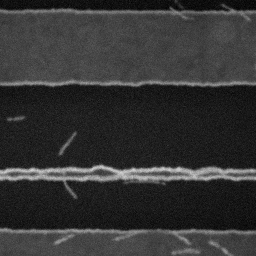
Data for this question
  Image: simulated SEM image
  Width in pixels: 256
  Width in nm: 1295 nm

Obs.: lines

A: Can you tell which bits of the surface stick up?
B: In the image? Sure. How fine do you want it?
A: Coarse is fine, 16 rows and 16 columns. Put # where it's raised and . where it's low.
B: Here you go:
................
################
################
################
################
................
................
................
................
................
................
................
................
................
################
################